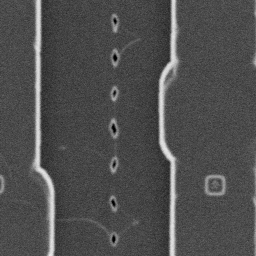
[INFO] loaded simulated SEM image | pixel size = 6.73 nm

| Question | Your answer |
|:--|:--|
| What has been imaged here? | wiring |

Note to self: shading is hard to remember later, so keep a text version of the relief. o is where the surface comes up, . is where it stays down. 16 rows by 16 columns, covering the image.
oo.........ooooo
oo.........ooooo
oo.........ooooo
oo.........ooooo
oo........oooooo
oo........oooooo
oo........oooooo
oo........oooooo
oo........oooooo
oo........oooooo
ooo........ooooo
ooo........oo.oo
ooo........ooooo
ooo........ooooo
ooo........ooooo
ooo........ooooo